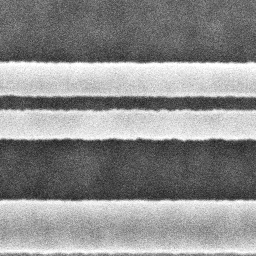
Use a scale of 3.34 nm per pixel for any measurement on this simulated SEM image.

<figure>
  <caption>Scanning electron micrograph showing lines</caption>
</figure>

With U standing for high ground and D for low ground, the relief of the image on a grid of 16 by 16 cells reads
DDDDDDDDDDDDDDDD
DDDDDDDDDDDDDDDD
DDDDDDDDDDDDDDDD
DDDDDDDDDDDDDDDD
UUUUUUUUUUUUUUUU
UUUUUUUUUUUUUUUU
UUUUUUUUUUUUUUUU
UUUUUUUUUUUUUUUU
UUUUUUUUUUUUUUUU
DDDDDDDDDDDDDDDD
DDDDDDDDDDDDDDDD
DDDDDDDDDDDDDDDD
DDDDDDDDDDDDDDDD
UUUUUUUUUUUUUUUU
UUUUUUUUUUUUUUUU
UUUUUUUUUUUUUUUU